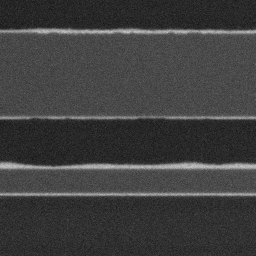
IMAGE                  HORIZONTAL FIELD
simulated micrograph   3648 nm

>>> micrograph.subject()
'lines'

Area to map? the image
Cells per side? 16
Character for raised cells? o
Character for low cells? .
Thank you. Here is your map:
................
................
oooooooooooooooo
oooooooooooooooo
oooooooooooooooo
oooooooooooooooo
oooooooooooooooo
................
................
................
ooo.oooooooooooo
oooooooooooooooo
................
................
................
................